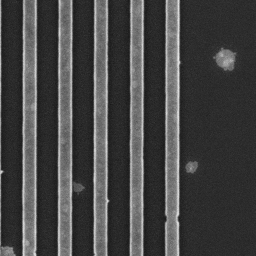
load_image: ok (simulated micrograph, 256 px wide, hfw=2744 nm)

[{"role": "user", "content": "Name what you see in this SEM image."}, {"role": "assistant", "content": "parallel lines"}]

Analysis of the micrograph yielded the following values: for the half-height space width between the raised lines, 23.5 px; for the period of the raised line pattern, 382 nm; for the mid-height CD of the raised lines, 137 nm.